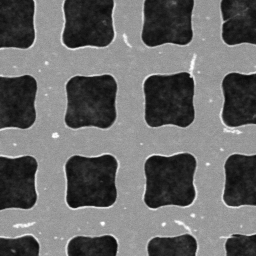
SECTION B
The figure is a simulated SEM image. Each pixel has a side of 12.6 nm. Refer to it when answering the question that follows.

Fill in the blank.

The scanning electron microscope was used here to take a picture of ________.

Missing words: holes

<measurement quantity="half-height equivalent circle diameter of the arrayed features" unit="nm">710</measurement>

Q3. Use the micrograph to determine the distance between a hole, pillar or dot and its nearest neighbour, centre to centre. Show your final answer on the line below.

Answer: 988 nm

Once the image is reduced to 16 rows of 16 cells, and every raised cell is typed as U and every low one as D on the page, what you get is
DDUUDDDUUDDDUUDD
DDUUDDDUUDDDUUDD
DDUUDDDUUDDDUUDD
UUUUUUUUUUUUUUUU
UUUUUUUUUUUUUUUU
DDUUDDDUUDDDUUDD
DDUUDDDUUDDDUUDD
DDUUDDDUUDDDUUDD
UUUUUUUUUUUUUUUU
UUUUUUUUUUUUUUUU
DDUUDDDUUDDDUUDD
DDUUDDDUUDDDUUDD
DDUUDDDUUDDDUUDD
UUUUUUUUUUUUUUUU
UUUUUUUUUUUUUUUU
DDUUDDDUUDDDUUDD